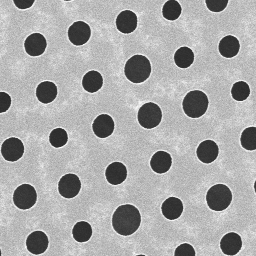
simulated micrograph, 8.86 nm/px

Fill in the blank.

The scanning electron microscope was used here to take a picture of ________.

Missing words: a regular array of holes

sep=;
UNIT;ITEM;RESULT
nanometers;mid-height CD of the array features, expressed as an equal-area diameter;204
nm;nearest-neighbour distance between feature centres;410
